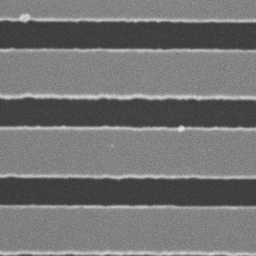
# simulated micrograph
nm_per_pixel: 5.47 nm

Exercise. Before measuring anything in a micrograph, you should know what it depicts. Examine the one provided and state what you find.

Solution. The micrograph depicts lines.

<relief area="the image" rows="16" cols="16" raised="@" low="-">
@@@@@@@@@@@@@@@@
----------------
----------------
@@@@@@@@@@@@@@@@
@@@@@@@@@@@@@@@@
@@@@@@@@@@@@@@@@
----------------
----------------
@@@@@@@@@@@@@@@@
@@@@@@@@@@@@@@@@
@@@@@@@@@@@@@@@@
----------------
----------------
@@@@@@@@@@@@@@@@
@@@@@@@@@@@@@@@@
@@@@@@@@@@@@@@@@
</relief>